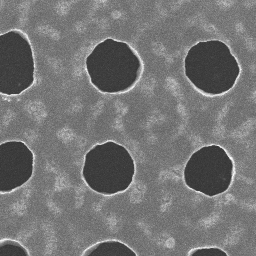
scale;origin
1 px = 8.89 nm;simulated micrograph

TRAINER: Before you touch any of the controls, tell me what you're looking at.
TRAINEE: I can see holes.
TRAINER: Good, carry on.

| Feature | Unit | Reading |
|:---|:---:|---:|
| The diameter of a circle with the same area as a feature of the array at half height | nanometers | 463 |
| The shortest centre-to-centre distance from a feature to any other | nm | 886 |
